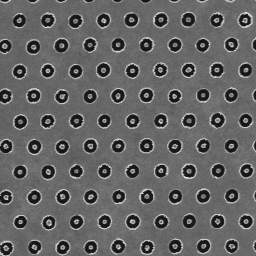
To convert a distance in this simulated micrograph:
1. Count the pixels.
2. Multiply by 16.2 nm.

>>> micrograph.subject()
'a regular array of ring-shaped grooves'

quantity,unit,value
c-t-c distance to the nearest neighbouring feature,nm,452